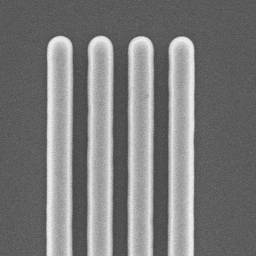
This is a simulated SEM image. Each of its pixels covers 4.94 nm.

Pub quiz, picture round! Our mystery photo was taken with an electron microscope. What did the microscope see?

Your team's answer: groups of lines, slits or small figures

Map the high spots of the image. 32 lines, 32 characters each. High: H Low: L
LLLLLLLLLLLLLLLLLLLLLLLLLLLLLLLL
LLLLLLLLLLLLLLLLLLLLLLLLLLLLLLLL
LLLLLLLLLLLLLLLLLLLLLLLLLLLLLLLL
LLLLLLLLLLLLLLLLLLLLLLLLLLLLLLLL
LLLLLLLLLLLLLLLLLLLLLLLLLLLLLLLL
LLLLLLHHHLLHHHLLHHHLLLHHLLLLLLLL
LLLLLLHHHLLHHHLLHHHLLHHHLLLLLLLL
LLLLLLHHHLLHHHLLHHHLLHHHLLLLLLLL
LLLLLLHHHLLHHHLLHHHLLHHHLLLLLLLL
LLLLLLHHHLLHHHLLHHHLLHHHLLLLLLLL
LLLLLLHHHLLHHHLLHHHLLHHHLLLLLLLL
LLLLLLHHHLLHHHLLHHHLLHHHLLLLLLLL
LLLLLLHHHLLHHHLLHHHLLHHHLLLLLLLL
LLLLLLHHHLLHHHLLHHHLLHHHLLLLLLLL
LLLLLLHHHLLHHHLLHHHLLHHHLLLLLLLL
LLLLLLHHHLLHHHLLHHHLLHHHLLLLLLLL
LLLLLLHHHLLHHHLLHHHLLHHHLLLLLLLL
LLLLLLHHHLLHHHLLHHHLLHHHLLLLLLLL
LLLLLLHHHLLHHHLLHHHLLHHHLLLLLLLL
LLLLLLHHHLLHHHLLHHHLLHHHLLLLLLLL
LLLLLLHHHLLHHHLLHHHLLHHHLLLLLLLL
LLLLLLHHHLLHHHLLHHHLLHHHLLLLLLLL
LLLLLLHHHLLHHHLLHHHLLHHHLLLLLLLL
LLLLLLHHHLLHHHLLHHHLLHHHLLLLLLLL
LLLLLLHHHLLHHHLLHHHLLHHHLLLLLLLL
LLLLLLHHHLLHHHLLHHHLLHHHLLLLLLLL
LLLLLLHHHLLHHHLLHHHLLHHHLLLLLLLL
LLLLLLHHHLLHHHLLHHHLLHHHLLLLLLLL
LLLLLLHHHLLHHHLLHHHLLHHHLLLLLLLL
LLLLLLHHHLLHHHLLHHHLLHHHLLLLLLLL
LLLLLLHHHLLHHHLLHHHLLHHHLLLLLLLL
LLLLLLHHHLLHHHLLHHHLLHHHLLLLLLLL